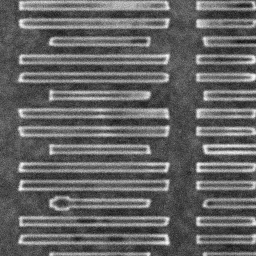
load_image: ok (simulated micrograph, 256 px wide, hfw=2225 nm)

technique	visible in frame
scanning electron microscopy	wiring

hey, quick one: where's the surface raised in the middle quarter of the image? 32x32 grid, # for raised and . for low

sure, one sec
................................
................................
##########################......
##########################......
................................
................................
................................
#####################...........
#####################...........
................................
................................
##########################......
##########################......
................................
................................
................................
##########################......
##########################......
................................
................................
#####################...........
#####################...........
................................
................................
................................
##########################......
##########################......
................................
................................
##########################......
##########################......
................................